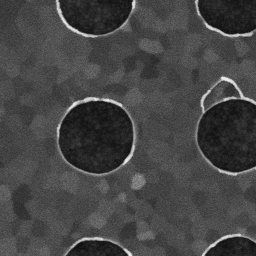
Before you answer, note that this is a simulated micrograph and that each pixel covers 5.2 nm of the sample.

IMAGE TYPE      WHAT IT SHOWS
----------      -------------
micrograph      holes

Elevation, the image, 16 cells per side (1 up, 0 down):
1111000011110000
1111000011111000
1111111111111111
1111111111111111
1111111111111111
1111111111111001
1111100111111000
1111000011111000
1111000011110000
1111000011111000
1111100111111100
1111111111111111
1111111111111111
1111111111111111
1111111111111111
1111100011111000